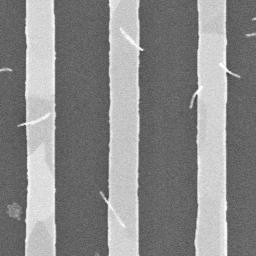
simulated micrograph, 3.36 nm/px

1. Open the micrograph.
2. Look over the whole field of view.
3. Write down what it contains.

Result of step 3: lines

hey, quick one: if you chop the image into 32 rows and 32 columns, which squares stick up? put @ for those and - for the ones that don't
---@@@@-------@@@--------@@@----
---@@@@-------@@@--------@@@----
---@@@@-------@@@--------@@@----
---@@@@-------@@@--------@@@----
---@@@@-------@@@--------@@@----
---@@@@-------@@@--------@@@----
---@@@@-------@@@--------@@@----
---@@@@-------@@@--------@@@----
---@@@@-------@@@--------@@@----
---@@@@-------@@@--------@@@----
---@@@@-------@@@--------@@@----
---@@@@-------@@@--------@@@----
---@@@@-------@@@--------@@@----
---@@@@-------@@@--------@@@----
---@@@@-------@@@--------@@@----
---@@@@-------@@@--------@@@----
---@@@@-------@@@--------@@@----
---@@@@-------@@@--------@@@----
---@@@@-------@@@--------@@@----
---@@@@-------@@@--------@@@----
---@@@@-------@@@--------@@@----
---@@@@-------@@@--------@@@----
----@@@-------@@@--------@@@----
---@@@@-------@@@--------@@@----
---@@@@-------@@@--------@@@----
---@@@@------@@@@--------@@@----
---@@@@-------@@@--------@@@----
---@@@@-------@@@--------@@@----
---@@@@-------@@@--------@@@----
---@@@@-------@@@--------@@@----
---@@@@-------@@@-------@@@@----
---@@@@-------@@@--------@@@----